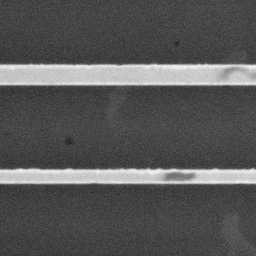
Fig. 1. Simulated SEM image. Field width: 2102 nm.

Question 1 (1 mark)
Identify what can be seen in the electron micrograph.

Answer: lines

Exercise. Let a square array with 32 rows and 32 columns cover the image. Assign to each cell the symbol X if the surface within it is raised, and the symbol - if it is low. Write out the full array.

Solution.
--------------------------------
--------------------------------
--------------------------------
--------------------------------
--------------------------------
--------------------------------
--------------------------------
--------------------------------
XXXXXXXXXXXXXXXXXXXXXXXXXXXXXXXX
XXXXXXXXXXXXXXXXXXXXXXXXXXXXXXXX
XXXXXXXXXXXXXXXXXXXXXXXXXXXXXXXX
--------------------------------
--------------------------------
--------------------------------
--------------------------------
--------------------------------
--------------------------------
--------------------------------
--------------------------------
--------------------------------
--------------------------------
XXXXXXXXXXXXXXXXXXXXXXXXXXXXXXXX
XXXXXXXXXXXXXXXXXXXXXXXXXXXXXXXX
--------------------------------
--------------------------------
--------------------------------
--------------------------------
--------------------------------
--------------------------------
--------------------------------
--------------------------------
--------------------------------